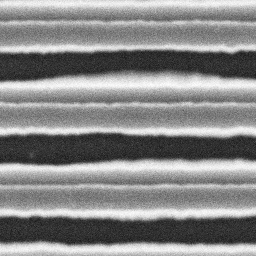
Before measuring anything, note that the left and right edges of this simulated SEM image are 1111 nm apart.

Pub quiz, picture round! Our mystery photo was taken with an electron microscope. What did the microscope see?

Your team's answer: lines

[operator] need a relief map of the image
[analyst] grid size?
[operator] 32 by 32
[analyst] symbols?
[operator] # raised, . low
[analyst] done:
################################
################################
################################
################################
################################
################################
................................
................................
................................
................................
........###################.....
################################
################################
################################
################################
################################
................................
................................
................................
................................
................................
################################
################################
################################
################################
################################
..##.##.############.######..#..
................................
................................
................................
................................
################################